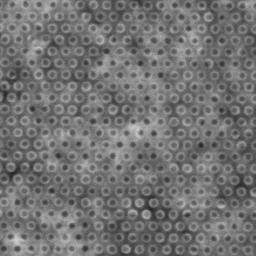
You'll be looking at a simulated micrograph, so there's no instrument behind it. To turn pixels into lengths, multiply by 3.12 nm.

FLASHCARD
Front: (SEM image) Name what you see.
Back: a regular array of raised bodies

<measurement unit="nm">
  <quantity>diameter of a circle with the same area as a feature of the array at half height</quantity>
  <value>27.1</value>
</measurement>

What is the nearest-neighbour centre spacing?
0.0412 micrometres